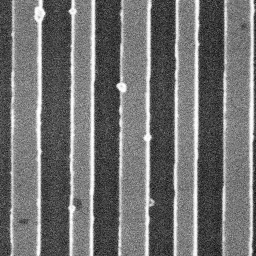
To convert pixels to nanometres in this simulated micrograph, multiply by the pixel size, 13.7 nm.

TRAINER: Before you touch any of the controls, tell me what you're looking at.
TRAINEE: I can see lines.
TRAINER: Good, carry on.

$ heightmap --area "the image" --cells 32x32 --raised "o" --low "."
..ooo....ooo...oooo...ooo...oooo
..ooo....ooo...oooo...ooo...oooo
..ooo....ooo...oooo...ooo...oooo
..ooo....ooo...oooo...ooo...oooo
..ooo....ooo...oooo...ooo...oooo
..ooo....ooo...oooo...ooo...oooo
..ooo....ooo...oooo...ooo...oooo
..ooo....ooo...oooo...ooo...oooo
..ooo....ooo...oooo...ooo...oooo
..ooo....ooo...oooo...ooo...oooo
..ooo....ooo...oooo...ooo...ooo.
..ooo....ooo...oooo...ooo...oooo
..ooo....ooo...oooo...ooo...oooo
..ooo....ooo...oooo...ooo...oooo
..ooo....ooo...oooo...ooo...ooo.
..ooo....ooo...oooo...ooo...ooo.
..ooo....ooo...oooo...ooo...ooo.
..ooo....ooo...oooo...ooo...ooo.
..ooo....ooo...oooo...ooo...ooo.
..ooo....ooo...oooo...ooo...ooo.
..ooo....ooo...oooo...ooo...ooo.
.oooo....ooo...oooo...ooo...ooo.
..ooo....ooo...oooo...ooo...ooo.
..ooo....ooo...ooo....ooo...ooo.
..ooo....ooo...ooo....ooo...ooo.
..ooo....ooo...ooo....ooo...ooo.
.oooo....ooo...ooo....ooo...ooo.
.oooo....ooo...ooo....ooo...ooo.
.oooo....ooo...ooo....ooo...ooo.
.oooo....ooo...ooo....ooo...ooo.
.oooo....ooo...ooo....ooo...ooo.
.oooo....ooo...ooo....oo....ooo.